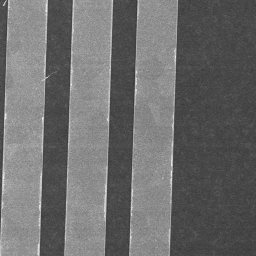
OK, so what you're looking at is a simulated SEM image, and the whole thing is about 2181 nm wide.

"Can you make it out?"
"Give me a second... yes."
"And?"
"one or a few lines or trenches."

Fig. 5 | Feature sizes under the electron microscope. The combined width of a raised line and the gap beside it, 64.9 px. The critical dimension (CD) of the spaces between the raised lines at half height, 216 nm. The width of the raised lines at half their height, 336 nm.